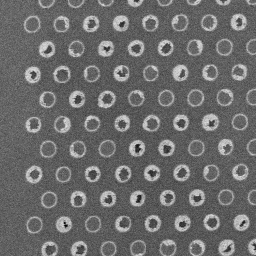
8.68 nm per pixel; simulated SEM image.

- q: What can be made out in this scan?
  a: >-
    a regular array of raised bodies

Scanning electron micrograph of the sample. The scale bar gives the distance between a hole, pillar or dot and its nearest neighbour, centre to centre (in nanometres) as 249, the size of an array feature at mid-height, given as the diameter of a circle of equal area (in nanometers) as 134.